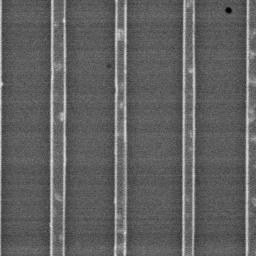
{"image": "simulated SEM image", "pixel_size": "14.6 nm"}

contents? one or a few lines or trenches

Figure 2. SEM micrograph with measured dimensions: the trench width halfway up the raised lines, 770 nm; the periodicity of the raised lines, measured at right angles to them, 956 nm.